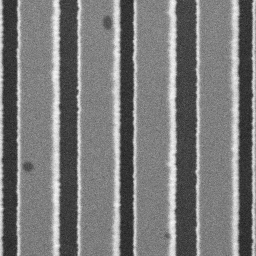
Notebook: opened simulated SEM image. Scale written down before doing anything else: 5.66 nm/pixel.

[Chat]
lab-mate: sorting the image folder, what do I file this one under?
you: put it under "lines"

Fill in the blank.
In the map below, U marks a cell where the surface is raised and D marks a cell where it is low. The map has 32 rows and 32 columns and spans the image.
DDUUUUUDDDUUUUUDDUUUUUDDDUUUUUDD
DDUUUUUDDDUUUUUDDUUUUUDDDUUUUUDD
DDUUUUUDDDUUUUUDDUUUUUDDDUUUUUDD
DDUUUUUDDDUUUUUDDUUUUUDDDUUUUUDD
DDUUUUUDDDUUUUUDDUUUUUDDDUUUUUDD
DDUUUUUDDDUUUUUDDUUUUUDDDUUUUUDD
DDUUUUUDDDUUUUUDDUUUUUDDDUUUUUDD
DDUUUUUDDDUUUUUDDUUUUUDDDUUUUUDD
DDUUUUUDDDUUUUUDDUUUUUDDDUUUUUDD
DDUUUUUDDDUUUUUDDUUUUUDDDUUUUUDD
DDUUUUUDDDUUUUUDDUUUUUDDDUUUUUDD
DDUUUUUDDDUUUUUDDUUUUUDDDUUUUUDD
DDUUUUUDDDUUUUUDDUUUUUDDDUUUUUDD
DDUUUUUDDDUUUUUDDUUUUUDDDUUUUUDD
DDUUUUUDDDUUUUUDDUUUUUDDDUUUUUDD
DDUUUUUDDDUUUUUDDUUUUUDDDUUUUUDD
DDUUUUUDDDUUUUUDDUUUUUDDDUUUUUDD
DDUUUUUDDDUUUUUDDUUUUUDDDUUUUUDD
DDUUUUUDDDUUUUUDDUUUUUDDDUUUUUDD
DDUUUUUDDDUUUUUDDUUUUUDDDUUUUUDD
DDUUUUUDDDUUUUUDDUUUUUDDDUUUUUDD
DDUUUUUDDDUUUUUDDUUUUUDDDUUUUUDD
DDUUUUUDDDUUUUUDDUUUUUDDDUUUUUDD
DDUUUUUDDDUUUUUDDUUUUUDDDUUUUUDD
DDUUUUUDDDUUUUUDDUUUUUDDDUUUUUDD
DDUUUUUDDDUUUUUDDUUUUUDDDUUUUUDD
DDUUUUUDDDUUUUUDDUUUUUDDDUUUUUDD
DDUUUUUDDDUUUUUDDUUUUUDDDUUUUUDD
DDUUUUUDDDUUUUUDDUUUUUDDDUUUUUDD
DDUUUUUDDDUUUUUDDUUUUUDDDUUUUUDD
DDUUUUUDDDUUUUUDDUUUUUDDDUUUUUDD
DDUUUUUDDDUUUUUDDUUUUUDDDUUUUUDD